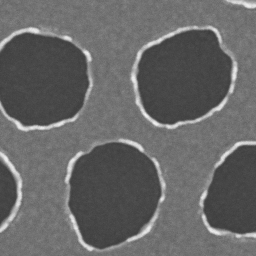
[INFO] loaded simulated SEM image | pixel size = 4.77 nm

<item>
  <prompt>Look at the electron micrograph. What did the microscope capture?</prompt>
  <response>holes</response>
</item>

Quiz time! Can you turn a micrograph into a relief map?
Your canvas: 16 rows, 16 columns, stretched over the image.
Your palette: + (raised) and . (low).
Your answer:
++++++++++++++++
++++++++++++++++
+...++++++....++
.....++++.....++
......+++......+
......+++.....++
.....++++.....++
+...++++++..++++
++++++++++++++++
++++++...+++++..
.++++.....++++..
.+++......+++...
.+++......+++...
.++++.....+++...
+++++....+++++..
++++++.+++++++++